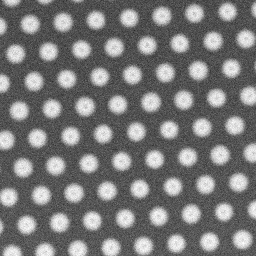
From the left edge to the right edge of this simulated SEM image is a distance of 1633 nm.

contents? an array of small figures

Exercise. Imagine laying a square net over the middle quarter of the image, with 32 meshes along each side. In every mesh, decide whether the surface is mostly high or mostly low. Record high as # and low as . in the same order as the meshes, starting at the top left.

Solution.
........................###.....
.......###.....####....####....#
###....####....####....#####...#
###....####....####....####.....
###....####.....###.............
##..............................
................................
.....................##.....####
....##......###.....####....####
...####....#####....####....####
...#####...#####....####....####
...####.....###.....###.........
....###.........................
................................
.........................##.....
.........##.....####....####....
###.....####....####....####....
####....####....####....####....
####....####.....###......#.....
###......##.....................
................................
..............................##
.............###.....###.....###
....####....#####....####....###
....####....#####....####....###
....####.....###.....###........
.....###......#.................
................................
................................
..................##.....####...
.###.....####....####....####...
#####....####....####....####...